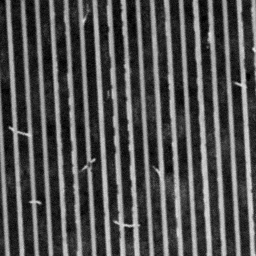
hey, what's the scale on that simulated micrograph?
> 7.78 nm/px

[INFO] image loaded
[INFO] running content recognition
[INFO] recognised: parallel lines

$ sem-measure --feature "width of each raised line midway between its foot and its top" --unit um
0.0291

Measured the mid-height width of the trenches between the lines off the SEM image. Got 80.6 nm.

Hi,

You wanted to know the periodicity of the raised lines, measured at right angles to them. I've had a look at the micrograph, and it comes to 112 nm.